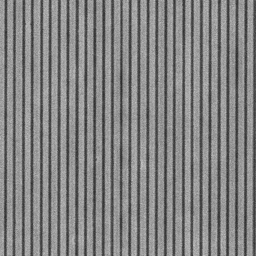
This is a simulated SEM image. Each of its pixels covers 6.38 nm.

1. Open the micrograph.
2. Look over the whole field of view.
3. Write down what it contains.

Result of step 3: parallel lines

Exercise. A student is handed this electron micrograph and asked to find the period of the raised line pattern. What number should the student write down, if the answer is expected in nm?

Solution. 56.7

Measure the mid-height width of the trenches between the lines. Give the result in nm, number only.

18.3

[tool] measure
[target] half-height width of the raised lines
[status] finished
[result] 35.9 nanometres